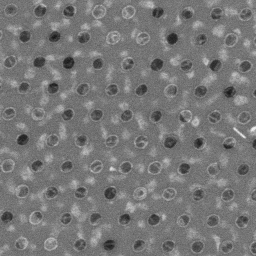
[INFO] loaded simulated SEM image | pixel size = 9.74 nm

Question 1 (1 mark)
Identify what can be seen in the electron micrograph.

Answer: a regular array of raised bodies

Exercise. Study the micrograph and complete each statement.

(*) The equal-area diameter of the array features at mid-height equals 120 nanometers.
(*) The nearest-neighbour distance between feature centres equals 284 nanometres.